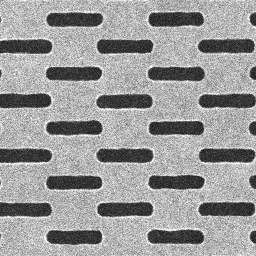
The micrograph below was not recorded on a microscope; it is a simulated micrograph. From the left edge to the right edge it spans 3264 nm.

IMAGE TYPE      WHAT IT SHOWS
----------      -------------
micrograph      a regular array of holes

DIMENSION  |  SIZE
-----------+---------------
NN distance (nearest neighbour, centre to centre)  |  689 nm